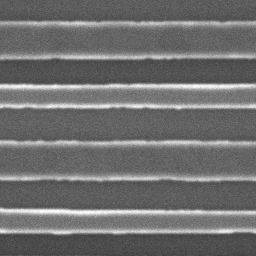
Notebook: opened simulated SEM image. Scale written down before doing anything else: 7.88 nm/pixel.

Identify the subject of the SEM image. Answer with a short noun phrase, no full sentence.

lines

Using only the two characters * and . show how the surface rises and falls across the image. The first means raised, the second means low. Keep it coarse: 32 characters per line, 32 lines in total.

................................
................................
................................
********************************
********************************
********************************
********************************
................................
................................
................................
................................
********************************
********************************
......................*.........
................................
................................
................................
................................
********************************
********************************
********************************
********************************
............*..........*****...*
................................
................................
................................
********************************
********************************
********************************
................................
................................
................................